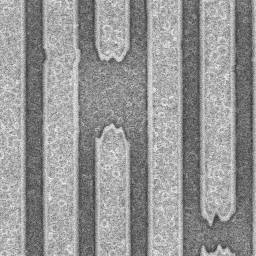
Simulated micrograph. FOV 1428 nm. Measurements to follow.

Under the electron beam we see parallel lines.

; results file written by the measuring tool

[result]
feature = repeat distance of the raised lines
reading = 292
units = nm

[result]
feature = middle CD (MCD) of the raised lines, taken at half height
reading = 181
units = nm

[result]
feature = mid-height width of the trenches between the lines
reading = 114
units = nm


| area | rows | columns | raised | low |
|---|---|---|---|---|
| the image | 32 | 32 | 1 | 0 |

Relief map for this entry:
11100011110011110001111001111000
11100011110011110001111001111000
11100011100011110001111001111000
11100011110011110001111001111000
11100011110011110001111001111000
11100011110011110001111001111000
11100011110011110001111001111000
11100011110000000001111001111000
11100011100000000001111001111000
11100011100000000001111001111000
11100011110000000001111001111000
11100011110000000001111001111000
11100011100000000001111001111000
11100011100000000001111001111000
11100011110000000001111001111000
11100011110000000001111001111000
11100011110001100001111001111000
11100011110011110001111001111000
11100011100011110001111001111000
11100011100011110001111001111000
11100011110011110001111001111000
11100011110011110001111001111000
11100011110011110001111001111000
11100011110011110001111001111000
11100011110011110001111001111000
11100011110011110001111001111000
11100011100011110001111001111000
11100011100011110001111000100000
11100011100011110001111000000000
11100011100011110001111000000000
11100011110011110001111000000000
11100011110011110001111000011000